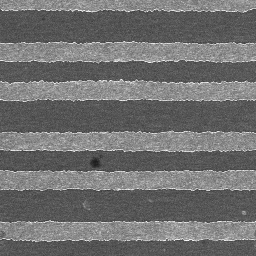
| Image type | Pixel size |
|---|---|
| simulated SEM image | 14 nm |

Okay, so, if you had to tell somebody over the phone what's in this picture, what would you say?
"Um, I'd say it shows parallel lines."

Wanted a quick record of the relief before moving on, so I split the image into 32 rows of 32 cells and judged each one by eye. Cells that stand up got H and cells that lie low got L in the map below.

HHHHHHHHHHHHHHHHHHHHHHHHHHHHHHHH
LLLLLLLLLLLLLLLLLLLLLLLLLLLLLLLL
LLLLLLLLLLLLLLLLLLLLLLLLLLLLLLLL
LLLLLLLLLLLLLLLLLLLLLLLLLLLLLLLL
LLLLLLLLLLLLLLLLLLLLLLLLLLLLLLLL
HHHHHHHHHHHHHHHHHHHHHHHHHLLHHHLH
HHHHHHHHHHHHHHHHHHHHHHHHHHHHHHHH
HHHHHHHHHHHHHHHHHHHHHHHHHHHHHHHH
LLLLLLLLLLLLLLLLLLLLLLLLLLLLLLLL
LLLLLLLLLLLLLLLLLLLLLLLLLLLLLLLL
HHHHHHHHHHHHHHHHHHHHHHHHHHHHHHHH
HHHHHHHHHHHHHHHHHHHHHHHHHHHHHHHH
HHHHLLLLLHHLLLLHLLLLHHHHHHHHHHLH
LLLLLLLLLLLLLLLLLLLLLLLLLLLLLLLL
LLLLLLLLLLLLLLLLLLLLLLLLLLLLLLLL
LLLLLLLLLLLLLLLLLLLLLLLLLLLLLLLL
LLLLLLLLLLLLLLLHLLLLLHLHLLLLLLLL
HHHHHHHHHHHHHHHHHHHHHHHHHHHHHHHH
HHHHHHHHHHHHHHHHHHHHHHHHHHHHHHHH
LLLLLLLLLLLLLLLLLLLLLLLLLLLLLLLL
LLLLLLLLLLLLLLLLLLLLLLLLLLLLLLLL
HHHHHHHHHHHHHLHHHHHHHHLHHHHHHHHH
HHHHHHHHHHHHHHHHHHHHHHHHHHHHHHHH
HHHHHHHHHHHHHHHHHHHHHHHHHHHHHHHH
LLLLLLLLLLLLLLLLLLLLLLLLLLLLLLLL
LLLLLLLLLLLLLLLLLLLLLLLLLLLLLLLL
LLLLLLLLLLLLLLLLLLLLLLLLLLLLLLLL
LLLLLLLLLLLLLLLLLLLLLLLLLLLLLLLL
HHHHHHHHHHHHHHHHHHHHHHHHHHHHHHHH
HHHHHHHHHHHHHHHHHHHHHHHHHHHHHHHH
LLLLLLLLLLLLLLLLLLLLLLLLLLLLLLLL
LLLLLLLLLLLLLLLLLLLLLLLLLLLLLLLL